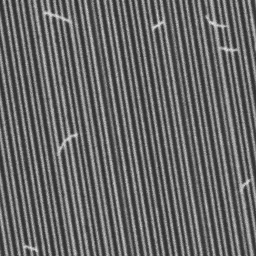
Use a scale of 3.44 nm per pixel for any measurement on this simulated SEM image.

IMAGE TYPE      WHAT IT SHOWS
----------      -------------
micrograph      parallel lines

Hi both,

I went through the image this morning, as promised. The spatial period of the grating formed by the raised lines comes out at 21.4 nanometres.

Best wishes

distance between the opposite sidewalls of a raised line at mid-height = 8.9 nanometers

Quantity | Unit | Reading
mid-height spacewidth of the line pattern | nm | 12.4